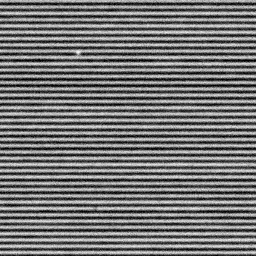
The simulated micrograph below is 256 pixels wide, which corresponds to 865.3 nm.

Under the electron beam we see parallel lines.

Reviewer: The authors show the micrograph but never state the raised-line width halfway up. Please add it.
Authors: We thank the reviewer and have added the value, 10.1 nm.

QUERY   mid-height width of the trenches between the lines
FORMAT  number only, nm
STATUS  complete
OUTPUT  10.1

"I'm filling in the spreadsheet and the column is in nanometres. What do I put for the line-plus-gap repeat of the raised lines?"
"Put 21.4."